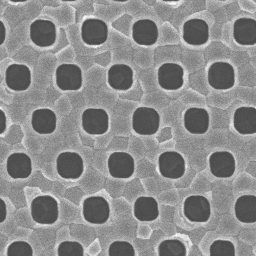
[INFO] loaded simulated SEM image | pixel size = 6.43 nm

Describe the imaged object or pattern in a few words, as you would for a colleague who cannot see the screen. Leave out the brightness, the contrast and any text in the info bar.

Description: a regular array of holes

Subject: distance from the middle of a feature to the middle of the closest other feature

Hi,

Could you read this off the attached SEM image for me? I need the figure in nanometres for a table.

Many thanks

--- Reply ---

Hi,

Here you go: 325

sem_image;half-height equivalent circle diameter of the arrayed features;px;27.2